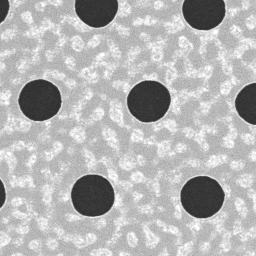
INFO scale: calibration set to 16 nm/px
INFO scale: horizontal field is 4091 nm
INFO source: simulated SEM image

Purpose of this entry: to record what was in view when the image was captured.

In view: holes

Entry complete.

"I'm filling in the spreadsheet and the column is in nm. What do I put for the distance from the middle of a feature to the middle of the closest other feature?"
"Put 1740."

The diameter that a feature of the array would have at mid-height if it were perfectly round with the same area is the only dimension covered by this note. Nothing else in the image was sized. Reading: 694 nm